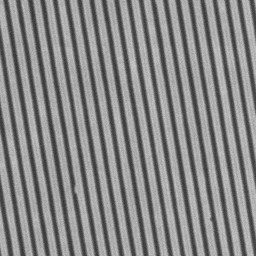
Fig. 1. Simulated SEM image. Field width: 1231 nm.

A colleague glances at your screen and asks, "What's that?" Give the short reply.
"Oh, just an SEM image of parallel lines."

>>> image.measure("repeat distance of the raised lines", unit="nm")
58.3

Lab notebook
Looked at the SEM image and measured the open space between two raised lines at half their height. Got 29 nanometres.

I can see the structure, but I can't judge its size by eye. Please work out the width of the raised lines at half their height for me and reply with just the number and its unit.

0.029 um